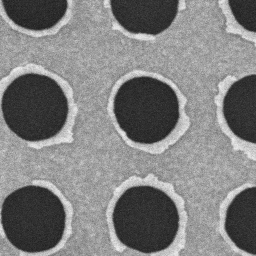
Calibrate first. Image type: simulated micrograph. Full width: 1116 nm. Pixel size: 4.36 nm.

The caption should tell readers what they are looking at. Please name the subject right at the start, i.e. holes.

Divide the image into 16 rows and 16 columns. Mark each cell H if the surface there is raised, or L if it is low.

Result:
LLLLHHHLLLLHHHLL
HLLHHHHHLLLHHHHL
HHHHHHHHHHHHHHHH
HHHHHHHHHHHHHHHH
HHHHHHHHHHHHHHHH
LLLLHHHHLLLHHHLL
LLLLHHHLLLLHHHLL
LLLLHHHLLLLHHHLL
HLLHHHHHLLHHHHHL
HHHHHHHHHHHHHHHH
HHHHHHHHHHHHHHHH
HHHHHHHHHHHHHHHH
LLLLHHHLLLLHHHHL
LLLLHHHLLLLHHHLL
LLLLHHHLLLLHHHLL
HLLHHHHHLLHHHHHL